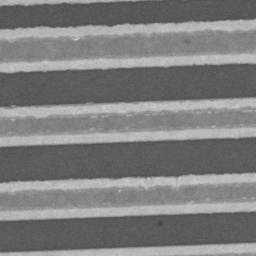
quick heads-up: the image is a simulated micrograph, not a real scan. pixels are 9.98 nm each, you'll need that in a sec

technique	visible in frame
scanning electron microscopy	one or a few lines or trenches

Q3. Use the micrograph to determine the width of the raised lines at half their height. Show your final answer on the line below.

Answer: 0.281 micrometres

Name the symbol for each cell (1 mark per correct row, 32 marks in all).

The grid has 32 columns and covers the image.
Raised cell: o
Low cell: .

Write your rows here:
................................
................................
................................
.......................ooooooooo
oooooooooooooooooooooooooooooooo
oooooooooooooooooooooooooooooooo
oooooooooooooooooooooooooooooooo
ooooooooooooooooooooooo.........
................................
................................
................................
................................
................................
................o.oooooooooooooo
oooooooooooooooooooooooooooooooo
oooooooooooooooooooooooooooooooo
oooooooooooooooooooooooooooooo..
oooo............................
................................
................................
................................
................................
..........................oooooo
o.oooooooooooooooooooooooooooooo
oooooooooooooooooooooooooooooooo
oooooooooooooooooooooooooooooooo
ooooooooooo.....................
................................
................................
................................
................................
....................oooooooooooo